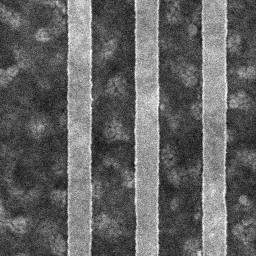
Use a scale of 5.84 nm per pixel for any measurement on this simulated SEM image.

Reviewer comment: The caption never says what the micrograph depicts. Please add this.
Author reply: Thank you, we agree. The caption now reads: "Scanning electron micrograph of one or a few lines or trenches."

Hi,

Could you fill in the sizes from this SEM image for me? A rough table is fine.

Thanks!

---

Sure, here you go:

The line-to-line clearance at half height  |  0.262 um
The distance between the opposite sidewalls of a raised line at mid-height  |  132 nanometers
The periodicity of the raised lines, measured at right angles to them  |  0.392 micrometres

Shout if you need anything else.